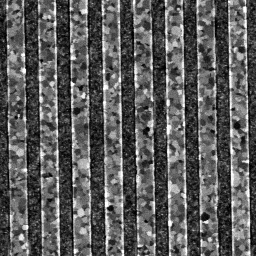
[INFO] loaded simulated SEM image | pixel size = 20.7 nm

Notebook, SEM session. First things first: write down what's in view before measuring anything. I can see parallel lines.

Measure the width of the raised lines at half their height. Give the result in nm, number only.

342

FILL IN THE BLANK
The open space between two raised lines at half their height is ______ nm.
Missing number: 306